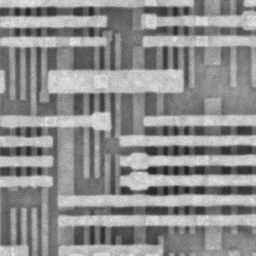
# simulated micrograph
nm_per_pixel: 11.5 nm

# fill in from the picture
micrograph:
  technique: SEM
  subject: wiring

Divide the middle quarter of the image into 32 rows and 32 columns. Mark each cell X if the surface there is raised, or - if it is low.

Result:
--------------------------------
--------------------------X-----
XXXXXXXXXXXXXXXXXXXXXXXXXXXXXX--
XXXXXXXXXXXXXXXXXXXXXXXXXXXXXX--
XXXXXXXXXXXXXXXXXXXXXXXXXXXXXX--
XXXXXXXXXXXXXXXXXXXXXXXXXXXXXX--
XXXXXXXXXXXXXXXXXXXXXXXXXXXXXX--
--------------------------------
--------------------------------
--------------------------------
--------------------------------
--------------------------------
-------XXXX---------------------
XXXXXXXXXXX---------XXXXXXXXXXXX
XXXXXXXXXXX---------XXXXXXXXXXXX
-------XXXXX--------------------
--------------------------------
--------------------------------
--------------XXXXXXXXXXXXXXXXXX
--------------XXXXXXXXXXXXXXXXXX
--------------------------------
--------------------------------
-----------------XX-------------
--------------XXXXXXXXXXXXXXXXXX
--------------XXXXXXXXXXXXXXXXXX
-----------------XXXX-----------
--------------------------------
-----------------XXXX-----------
--------------XXXXXXXXXXXXXXXXXX
--------------XXXXXXXXXXXXXXXXXX
---------------XXXXXXX----------
--------------------------------